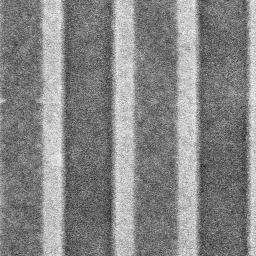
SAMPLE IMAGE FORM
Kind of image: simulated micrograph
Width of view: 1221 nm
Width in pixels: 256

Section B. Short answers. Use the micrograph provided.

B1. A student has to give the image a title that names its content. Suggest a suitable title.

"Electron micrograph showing one or a few lines or trenches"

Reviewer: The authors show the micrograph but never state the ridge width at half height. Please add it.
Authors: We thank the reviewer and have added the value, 0.304 um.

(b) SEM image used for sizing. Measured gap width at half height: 0.34 um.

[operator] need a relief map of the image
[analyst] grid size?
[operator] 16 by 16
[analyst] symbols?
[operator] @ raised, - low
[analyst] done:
@@@-----@@@@----
@@@-----@@@@----
@@@-----@@@@----
@@@-----@@@@----
@@@-----@@@@----
@@@-----@@@@----
@@@-----@@@@----
@@@-----@@@@----
@@@-----@@@@----
@@@-----@@@@----
@@@-----@@@@----
@@@-----@@@@----
@@@-----@@@@----
@@@-----@@@@----
@@@-----@@@@----
@@@-----@@@@----